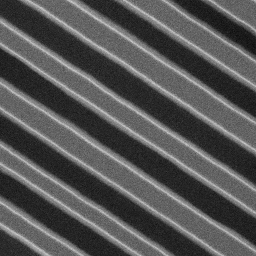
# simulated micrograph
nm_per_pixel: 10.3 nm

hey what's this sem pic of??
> lines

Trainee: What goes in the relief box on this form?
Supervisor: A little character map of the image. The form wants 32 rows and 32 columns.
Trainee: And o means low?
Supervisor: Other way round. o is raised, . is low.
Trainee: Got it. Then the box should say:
....oooooo......ooooo......ooooo
......ooooo.......ooooo.....oooo
.......oooooo......ooooo......oo
o........ooooo.......ooooo.....o
ooo.......oooooo......ooooo.....
oooo........ooooo.......ooooo...
.ooooo.......oooooo......ooooo..
...oooo........ooooo.......ooooo
....ooooo.......oooooo......oooo
......ooooo.......ooooo.......oo
.......ooooo.......oooooo......o
oo.......oooo........ooooo......
ooo.......ooooo.......oooooo....
ooooo.......ooooo.......ooooo...
.oooooo......ooooo.......oooooo.
...ooooo.......ooooo.......ooooo
....oooooo......ooooo.......oooo
......ooooo.......ooooo.......oo
o......ooooo........oooo.......o
oo.......ooooo.......ooooo......
oooo......oooooo.......oooo.....
.oooo.......ooooo.......ooooo...
...oooo......oooooo.......oooo..
.....ooo.......ooooo.......ooooo
......oooo.......ooooo.......ooo
o.......ooo.......ooooo.......oo
oo.......oooo......oooooo.......
oooo.......ooo.......ooooo......
.oooo.......oooo.......ooooo....
..ooooo.......ooo.......ooooo...
....oooo.......oooo.......ooooo.
.....ooooo.......ooo.......ooooo